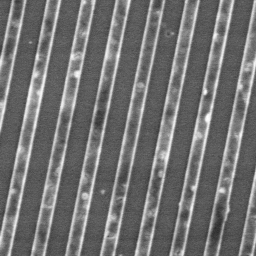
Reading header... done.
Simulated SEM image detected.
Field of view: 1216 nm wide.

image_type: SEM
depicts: parallel lines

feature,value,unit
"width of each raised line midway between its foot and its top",65.8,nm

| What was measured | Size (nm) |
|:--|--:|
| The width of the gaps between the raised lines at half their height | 96.8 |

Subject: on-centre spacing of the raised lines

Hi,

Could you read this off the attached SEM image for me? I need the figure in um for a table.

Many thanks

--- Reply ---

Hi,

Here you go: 0.162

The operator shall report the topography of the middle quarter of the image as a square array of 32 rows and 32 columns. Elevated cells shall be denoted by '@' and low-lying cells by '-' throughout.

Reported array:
-@@@------@@@-----@@@@-----@@@@-
-@@@------@@@-----@@@@-----@@@--
-@@@-----@@@@-----@@@------@@@--
-@@@-----@@@@-----@@@------@@@--
@@@@-----@@@------@@@-----@@@@--
@@@------@@@-----@@@@-----@@@---
@@@------@@@-----@@@@-----@@@---
@@@-----@@@@-----@@@@-----@@@---
@@@-----@@@@-----@@@------@@@---
@@@-----@@@------@@@-----@@@@---
@@------@@@-----@@@@-----@@@@---
@@------@@@-----@@@@-----@@@----
@@-----@@@@-----@@@@-----@@@----
@@-----@@@@-----@@@------@@@----
@@-----@@@------@@@-----@@@@----
@------@@@-----@@@@-----@@@@----
@------@@@-----@@@@-----@@@-----
@-----@@@@-----@@@@-----@@@-----
@-----@@@@-----@@@------@@@-----
@-----@@@------@@@-----@@@@-----
@-----@@@------@@@-----@@@@-----
------@@@-----@@@@-----@@@------
-----@@@@-----@@@@-----@@@------
-----@@@@-----@@@------@@@-----@
-----@@@------@@@-----@@@@-----@
-----@@@------@@@-----@@@@-----@
-----@@@-----@@@@-----@@@------@
----@@@@-----@@@@-----@@@------@
----@@@@-----@@@------@@@-----@@
----@@@------@@@-----@@@@-----@@
----@@@------@@@-----@@@@-----@@
----@@@-----@@@@-----@@@------@@